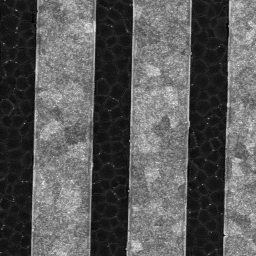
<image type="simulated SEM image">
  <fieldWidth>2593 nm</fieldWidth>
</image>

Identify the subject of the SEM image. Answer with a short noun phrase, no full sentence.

one or a few lines or trenches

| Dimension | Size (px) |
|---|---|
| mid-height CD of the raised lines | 57.7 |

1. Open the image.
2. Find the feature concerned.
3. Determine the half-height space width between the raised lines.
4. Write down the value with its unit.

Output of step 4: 392 nanometers